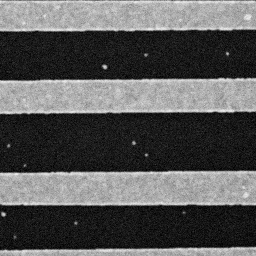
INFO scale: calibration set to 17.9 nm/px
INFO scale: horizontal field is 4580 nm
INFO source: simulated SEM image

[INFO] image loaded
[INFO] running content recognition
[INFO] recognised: lines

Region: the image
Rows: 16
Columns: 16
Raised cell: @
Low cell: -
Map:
@@@@@@@@@@@@@@@@
@@@@@@@@@@@@@@@@
----------------
----------------
----------------
@@@@@@@@@@@@@@@@
@@@@@@@@@@@@@@@@
----------------
----------------
----------------
----------------
@@@@@@@@@@@@@@@@
@@@@@@@@@@@@@@@@
----------------
----------------
---------------@